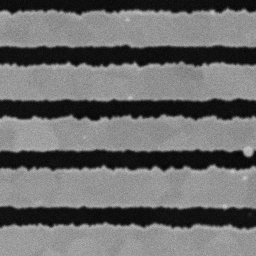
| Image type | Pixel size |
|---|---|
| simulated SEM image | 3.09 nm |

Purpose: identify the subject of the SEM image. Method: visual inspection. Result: lines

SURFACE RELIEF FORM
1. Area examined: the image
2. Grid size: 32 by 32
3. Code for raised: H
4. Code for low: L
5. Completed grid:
LLLLLLLLLLLLLLLLLLLLLLLLLLLLLLLL
HLHHHHHHLLLHHLLHHHHHHLLLHHHLHHHL
HHHHHHHHHHHHHHHHHHHHHHHHHHHHHHHH
HHHHHHHHHHHHHHHHHHHHHHHHHHHHHHHH
HHHHHHHHHHHHHHHHHHHHHHHHHHHHHHHH
HHHHHHHHHHHHHHHHHHHHHHHHHHHHHHHH
LLLLLLLLLLLLLLLLLLLLLLLLLLLLLLLL
LLLLLLLLLLLLLLLLLLLLLLLLLLLLLLLL
HHHHHHHHHHHHHHHHHHHHHHHHHHHHHHHH
HHHHHHHHHHHHHHHHHHHHHHHHHHHHHHHH
HHHHHHHHHHHHHHHHHHHHHHHHHHHHHHHH
HHHHHHHHHHHHHHHHHHHHHHHHHHHHHHHH
LLHHHLHLLHLHHHLHHLLHLLLHHHLLHLLL
LLLLLLLLLLLLLLLLLLLLLLLLLLLLLLLL
LLLLLLLLHLLLLLLLLLLLHLLLLLLLLLLL
HHHHHHHHHHHHHHHHHHHHHHHHHHHHHHHH
HHHHHHHHHHHHHHHHHHHHHHHHHHHHHHHH
HHHHHHHHHHHHHHHHHHHHHHHHHHHHHHHH
HHHHHHHHHHHHHHHHHHHHHHHHHHHHHHHH
LLLLLLLLLLLLLLLLLLLLLLLLLLLLLLLL
LLLLLLLLLLLLLLLLLLLLLLLLLLLLLLLL
HHHHHHHHHHHHHHHHHHHHHHHHHHHHHHHH
HHHHHHHHHHHHHHHHHHHHHHHHHHHHHHHH
HHHHHHHHHHHHHHHHHHHHHHHHHHHHHHHH
HHHHHHHHHHHHHHHHHHHHHHHHHHHHHHHH
HHHHHHHHHHHHHHHHHHHHHHHHHHHHHHHH
LLLLLLLLLLLLLLLLLLLLLLLLLLLLLLLL
LLLLLLLLLLLLLLLLLLLLLLLLLLLLLLLL
HHHHHHHHHHHHHHHHHHHHHHHHHHHHHHLH
HHHHHHHHHHHHHHHHHHHHHHHHHHHHHHHH
HHHHHHHHHHHHHHHHHHHHHHHHHHHHHHHH
HHHHHHHHHHHHHHHHHHHHHHHHHHHHHHHH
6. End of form